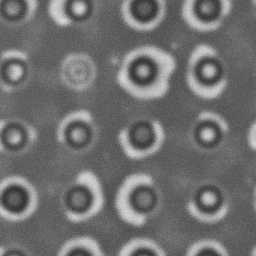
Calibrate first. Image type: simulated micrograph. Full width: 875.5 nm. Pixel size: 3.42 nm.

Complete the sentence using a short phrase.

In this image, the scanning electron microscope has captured a regular array of ring-shaped grooves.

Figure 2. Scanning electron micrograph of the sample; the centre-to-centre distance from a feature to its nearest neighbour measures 218 nanometers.